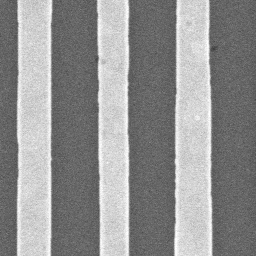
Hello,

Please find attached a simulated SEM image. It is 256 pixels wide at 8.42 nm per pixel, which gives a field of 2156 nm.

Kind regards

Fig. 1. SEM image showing lines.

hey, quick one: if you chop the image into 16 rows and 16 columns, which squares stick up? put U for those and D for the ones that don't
DUUDDDUUDDDUUDDD
DUUDDDUUDDDUUDDD
DUUDDDUUDDDUUDDD
DUUDDDUUDDDUUDDD
DUUDDDUUDDDUUDDD
DUUDDDUUDDDUUDDD
DUUDDDUUDDDUUDDD
DUUDDDUUDDDUUDDD
DUUDDDUUDDDUUDDD
DUUDDDUUDDDUUDDD
DUUDDDUUDDDUUDDD
DUUDDDUUDDDUUDDD
DUUDDDUUDDDUUDDD
DUUDDDUUDDDUUDDD
DUUDDDUUDDDUUDDD
DUUDDDUUDDDUUDDD